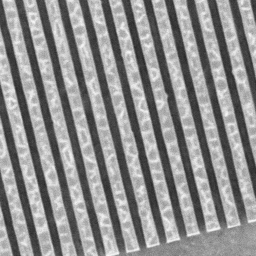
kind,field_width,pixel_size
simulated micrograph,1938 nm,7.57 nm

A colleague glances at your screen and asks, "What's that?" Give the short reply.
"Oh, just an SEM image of parallel lines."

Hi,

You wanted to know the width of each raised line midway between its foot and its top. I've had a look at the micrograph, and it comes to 0.0892 um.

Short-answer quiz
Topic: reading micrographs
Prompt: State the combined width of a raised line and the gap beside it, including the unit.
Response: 157 nm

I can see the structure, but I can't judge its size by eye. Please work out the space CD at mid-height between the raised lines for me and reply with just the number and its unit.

64.4 nanometers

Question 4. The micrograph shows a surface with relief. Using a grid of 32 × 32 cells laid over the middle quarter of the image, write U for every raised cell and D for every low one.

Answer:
UUDDUUUUDDUUUDDUUUDDDUUUDDUUUDDU
UUDDDUUUDDUUUDDDUUUDDUUUDDUUUDDU
UUUDDUUUDDUUUDDDUUUDDUUUDDUUUDDD
UUUDDUUUDDDUUUDDUUUDDDUUDDDUUUDD
UUUDDUUUUDDUUUDDUUUDDDUUUDDUUUDD
UUUDDDUUUDDUUUDDDUUUDDUUUDDUUUDD
DUUUDDUUUDDUUUDDDUUUDDUUUDDUUUDD
DUUUDDUUUDDDUUUDDUUUDDUUUUDDUUUD
DUUUDDUUUDDDUUUDDUUUDDDUUUDDUUUD
DUUUDDDUUUDDUUUDDDUUUDDUUUDDUUUD
DDUUUDDUUUDDUUUDDDUUUDDUUUDDUUUD
DDUUUDDUUUDDDUUUDDUUUDDUUUDDDUUU
DDUUUDDDUUDDDUUUDDUUUDDDUUDDDUUU
DDUUUDDDUUUDDUUUDDUUUDDDUUUDDUUU
DDDUUUDDUUUDDDUUDDDUUUDDUUUDDUUU
DDDUUUDDUUUDDDUUUDDUUUDDUUUDDDUU
UDDUUUDDUUUDDDUUUDDUUUDDUUUUDDUU
UDDUUUDDDUUUDDUUUDDUUUDDDUUUDDUU
UDDDUUUDDUUUDDUUUDDDUUUDDUUUDDUU
UDDDUUUDDUUUDDDUUUDDUUUDDUUUDDDU
UUDDUUUDDUUUDDDUUUDDUUUDDUUUDDDU
UUDDUUUDDDUUUDDUUUDDUUUDDDUUUDDU
UUDDDUUUDDUUUDDUUUDDDUUUDDUUUDDU
UUDDDUUUDDUUUDDUUUDDDUUUDDUUUDDD
UUUDDUUUDDUUUDDDUUUDDUUUDDDUUDDD
UUUDDUUUDDDUUUDDUUUDDUUUDDDUUUDD
UUUDDDUUUDDUUUDDUUUDDDUUUDDUUUDD
UUUDDDUUUDDUUUDDUUUDDDUUUDDUUUDD
DUUUDDUUUDDUUUDDDUUUDDUUUDDDUUDD
DUUUDDUUUDDUUUDDDUUUDDUUUDDDUUUD
DUUUDDUUUDDDUUUDDUUUDDDUUUDDUUUD
DUUUDDDUUUDDUUUDDUUUUDDUUUDDUUUD